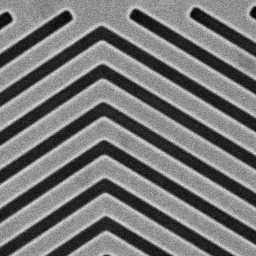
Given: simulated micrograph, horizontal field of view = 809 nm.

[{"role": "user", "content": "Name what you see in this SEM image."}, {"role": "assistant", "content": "groups of lines, slits or small figures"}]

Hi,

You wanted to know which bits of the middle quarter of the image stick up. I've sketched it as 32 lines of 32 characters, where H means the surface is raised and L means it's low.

HHHHHHHHLLLHHHHHHHHHLLLLLLHHHHHH
HHHHHHHLLLLLLHHHHHHHHHLLLLLLHHHH
HHHHHLLLLLLLLLHHHHHHHHHHLLLLLLHH
HHHHLLLLLLLLLLLLHHHHHHHHHLLLLLLL
HHLLLLLLHHHLLLLLLHHHHHHHHHHLLLLL
HLLLLLHHHHHHHLLLLLLHHHHHHHHHHLLL
LLLLLHHHHHHHHHHLLLLLLHHHHHHHHHLL
LLLLHHHHHHHHHHHHLLLLLLHHHHHHHHHH
LLHHHHHHHHHHHHHHHHLLLLLLHHHHHHHH
HHHHHHHHHHHHHHHHHHHHLLLLLLHHHHHH
HHHHHHHHLLLLHHHHHHHHHLLLLLLHHHHH
HHHHHHLLLLLLLLHHHHHHHHHLLLLLLHHH
HHHHHLLLLLLLLLLHHHHHHHHHHLLLLLLH
HHHLLLLLLHLLLLLLLHHHHHHHHHLLLLLL
HHLLLLLHHHHHLLLLLLLHHHHHHHHHLLLL
LLLLLLHHHHHHHHLLLLLLHHHHHHHHHHLL
LLLLLHHHHHHHHHHHLLLLLLHHHHHHHHHL
LLLHHHHHHHHHHHHHHLLLLLLHHHHHHHHH
LHHHHHHHHHHHHHHHHHHLLLLLLHHHHHHH
HHHHHHHHHLLHHHHHHHHHHLLLLLLHHHHH
HHHHHHHLLLLLLHHHHHHHHHLLLLLLLHHH
HHHHHHLLLLLLLLLHHHHHHHHHLLLLLLHH
HHHHLLLLLLLLLLLLHHHHHHHHHHLLLLLL
HHHLLLLLLHHHLLLLLLHHHHHHHHHLLLLL
HLLLLLLHHHHHHLLLLLLLHHHHHHHHHLLL
LLLLLLHHHHHHHHHLLLLLLHHHHHHHHHHL
LLLLHHHHHHHHHHHHHLLLLLLHHHHHHHHH
LLLHHHHHHHHHHHHHHHHLLLLLLHHHHHHH
LHHHHHHHHHHHHHHHHHHHLLLLLLHHHHHH
HHHHHHHHLLLLHHHHHHHHHHLLLLLLHHHH
HHHHHHHLLLLLLLHHHHHHHHHLLLLLLHHH
HHHHHLLLLLLLLLLLHHHHHHHHHLLLLLLH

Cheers